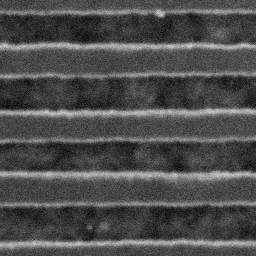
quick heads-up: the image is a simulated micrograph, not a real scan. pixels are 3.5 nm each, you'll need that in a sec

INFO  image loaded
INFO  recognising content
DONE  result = lines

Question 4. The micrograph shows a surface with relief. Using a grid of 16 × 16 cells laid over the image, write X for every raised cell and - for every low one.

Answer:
XXXXXXXXXXXXXXXX
----------------
----------------
XXXXXXXXXXXXXXXX
XXXXXXXXXXXXXXXX
----------------
----------------
XXXXXXXXXXXXXXXX
XXXXXXXXXXXXXXXX
----------------
----------------
XXXXXXXXXXXXXXXX
XXXXXXXXXXXXXXXX
----------------
----------------
XXXXXXXXXXXXXXXX